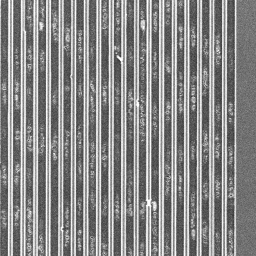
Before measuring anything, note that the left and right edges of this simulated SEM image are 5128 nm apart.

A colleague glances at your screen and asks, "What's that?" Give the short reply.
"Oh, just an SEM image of parallel lines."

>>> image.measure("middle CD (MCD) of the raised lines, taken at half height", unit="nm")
75.1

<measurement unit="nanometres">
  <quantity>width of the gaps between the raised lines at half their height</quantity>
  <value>170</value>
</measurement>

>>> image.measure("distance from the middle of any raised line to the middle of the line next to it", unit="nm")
252